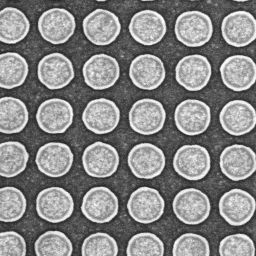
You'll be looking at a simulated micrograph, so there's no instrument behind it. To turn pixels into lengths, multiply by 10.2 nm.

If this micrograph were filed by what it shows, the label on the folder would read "a regular array of raised bodies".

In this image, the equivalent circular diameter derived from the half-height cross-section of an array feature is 0.347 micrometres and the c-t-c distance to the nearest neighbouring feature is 452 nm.